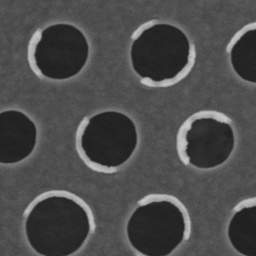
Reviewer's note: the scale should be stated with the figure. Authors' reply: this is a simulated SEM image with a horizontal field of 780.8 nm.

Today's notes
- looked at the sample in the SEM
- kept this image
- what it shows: holes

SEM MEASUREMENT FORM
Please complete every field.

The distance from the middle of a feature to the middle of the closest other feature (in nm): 303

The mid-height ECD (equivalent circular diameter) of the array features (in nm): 165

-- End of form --